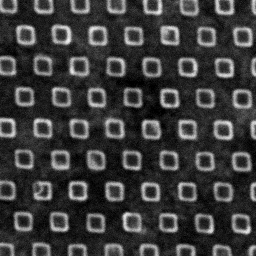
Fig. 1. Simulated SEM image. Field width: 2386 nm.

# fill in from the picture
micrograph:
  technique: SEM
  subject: a regular array of raised bodies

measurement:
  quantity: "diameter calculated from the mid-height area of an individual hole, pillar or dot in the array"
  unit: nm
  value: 169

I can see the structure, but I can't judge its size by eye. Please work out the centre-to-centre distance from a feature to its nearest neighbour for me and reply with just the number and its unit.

332 nm